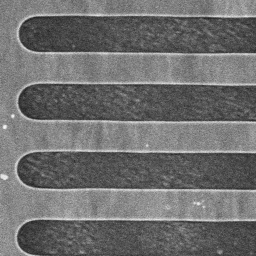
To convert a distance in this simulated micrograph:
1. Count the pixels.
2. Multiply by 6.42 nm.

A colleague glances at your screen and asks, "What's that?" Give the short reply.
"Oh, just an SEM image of groups of lines, slits or small figures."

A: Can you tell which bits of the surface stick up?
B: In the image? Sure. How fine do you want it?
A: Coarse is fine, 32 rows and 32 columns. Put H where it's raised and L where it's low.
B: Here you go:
HHHHHHHHHHHHHHHHHHHHHHHHHHHHHHHH
HHHHHHHHHHHHHHHHHHHHHHHHHHHHHHHH
HHHLLLLLLLLLLLLLLLLLLLLLLLLLLLLL
HHLLLLLLLLLLLLLLLLLLLLLLLLLLLLLL
HHLLLLLLLLLLLLLLLLLLLLLLLLLLLLLL
HHHLLLLLLLLLLLLLLLLLLLLLLLLLLLLL
HHHHHLLLLLLLLLLLLLLLLLLLLLLLLLLL
HHHHHHHHHHHHHHHHHHHHHHHHHHHHHHHH
HHHHHHHHHHHHHHHHHHHHHHHHHHHHHHHH
HHHHHHHHHHHHHHHHHHHHHHHHHHHHHHHH
HHHHHLLLLLLLLLLLLLLLHHHHHHHHHHHH
HHHLLLLLLLLLLLLLLLLLLLLLLLLLLLLL
HHLLLLLLLLLLLLLLLLLLLLLLLLLLLLLL
HHLLLLLLLLLLLLLLLLLLLLLLLLLLLLLL
HHHLLLLLLLLLLLLLLLLLLLLLLLLLLLLL
HHHHHHHHHHHHHHHHHHHHHHHHHHHHHHHH
HHHHHHHHHHHHHHHHHHHHHHHHHHHHHHHH
HHHHHHHHHHHHHHHHHHHHHHHHHHHHHHHH
HHHHHHHHHHHHHHHHHHHHHHHHHHHHHHHH
HHHLLLLLLLLLLLLLLLLLLLLLLLLLLLLL
HHLLLLLLLLLLLLLLLLLLLLLLLLLLLLLL
HHLLLLLLLLLLLLLLLLLLLLLLLLLLLLLL
HHHLLLLLLLLLLLLLLLLLLLLLLLLLLLLL
HHHHLLLLLLLLLLLLLLLLLLLLLLLLLLLL
HHHHHHHHHHHHHHHHHHHHHHHHHHHHHHHH
HHHHHHHHHHHHHHHHHHHHHHHHHHHHHHHH
HHHHHHHHHHHHHHHHHHHHHHHHHHHHHHHH
HHHHLLLLLLLLLLLLLLLLLLLHHHHHHHHH
HHLLLLLLLLLLLLLLLLLLLLLLLLLLLLLL
HHLLLLLLLLLLLLLLLLLLLLLLLLLLLLLL
HHLLLLLLLLLLLLLLLLLLLLLLLLLLLLLL
HHHLLLLLLLLLLLLLLLLLLLLLLLLLLLLL